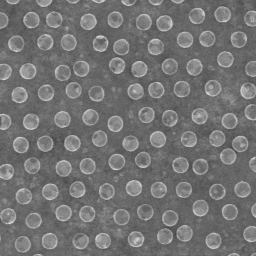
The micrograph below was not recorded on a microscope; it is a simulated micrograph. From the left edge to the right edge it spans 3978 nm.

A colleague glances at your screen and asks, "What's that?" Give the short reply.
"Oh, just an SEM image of a regular array of raised bodies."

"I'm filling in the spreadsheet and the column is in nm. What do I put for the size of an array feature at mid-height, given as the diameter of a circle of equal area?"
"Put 245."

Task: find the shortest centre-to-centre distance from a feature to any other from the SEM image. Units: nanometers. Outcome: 369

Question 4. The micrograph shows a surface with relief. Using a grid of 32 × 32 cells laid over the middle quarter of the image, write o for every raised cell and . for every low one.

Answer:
o.oooo.....oooo..oooo....ooo...o
oooooo......ooo..oooo....ooo...o
oo.ooo...........ooo...........o
o...............................
.............................o..
.ooo.............oo..oooo...ooo.
oooo..oooo......oooo.oooo...ooo.
.ooo..oooo......oooo..ooo...ooo.
.......ooo.......oo.............
................................
................................
......o............ooo..........
o....ooo...........oooo..ooo....
o....oooo...oo.....ooo...ooo....
o....ooo...oooo.....o....ooo....
o..........oooo...........o.....
............oo..................
........oo............ooo.....oo
.oo....oooo....ooo....ooo....ooo
oooo...oooo....oooo...ooo....ooo
oooo....oo.....oooo...oo......oo
.oo.............oo..............
..................ooo...........
...........oooo...oooo......oo..
o...ooo....oooo...oooo.....oooo.
oo..oooo....ooo....oo......oooo.
oo..oooo....................ooo.
o...............................
................................
...o............ooo.............
..ooo.....oo....ooo...ooo...oooo
..ooo....oooo...ooo...oooo..oooo